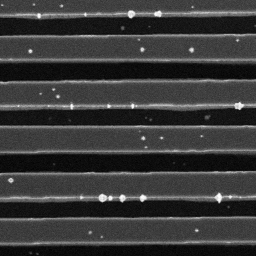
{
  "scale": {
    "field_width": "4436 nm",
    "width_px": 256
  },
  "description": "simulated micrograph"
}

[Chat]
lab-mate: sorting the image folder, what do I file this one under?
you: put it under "lines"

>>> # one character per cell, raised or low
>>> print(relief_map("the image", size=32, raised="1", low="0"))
11111111111111111111111111111111
11111111111111111111111111111111
00000000000000000000000000000000
00000000000000000000000000000000
00000000001111111111111111111111
11111111111111111111111111111111
11111111111111111111111111111111
00000000000000000011110011111111
00000000000000000000000000000000
00000000000000000000000000000000
11111111111111111111111111111111
11111111111111111111111111111111
11111111111111111111111111111111
00000000100000000000000000000000
00000000000000000000000000000000
00000000000000000000000000000000
11111111111111111111111111111111
11111111111111111111111111111111
11111111111111111111111111111111
00000000000000000000000000000000
00000000000000000000000000000000
00000000000000000000000000111111
11111111111111111111111111111111
11111111111111111111111111111111
11111111111111111111111111111111
00000000000000000000000000000000
00000000000000000000000000000000
11111111111111111111111111111111
11111111111111111111111111111111
11111111111111111111111111111111
00000000000000000000000000000000
00000000000000000000000000000000